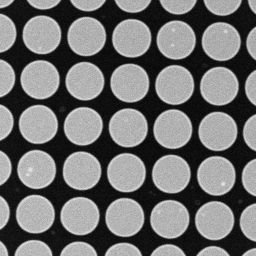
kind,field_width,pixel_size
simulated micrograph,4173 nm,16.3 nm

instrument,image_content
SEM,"an array of small figures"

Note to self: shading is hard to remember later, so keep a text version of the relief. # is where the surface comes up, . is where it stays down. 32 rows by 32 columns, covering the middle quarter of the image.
..######......#####.......###...
.########....#######.....######.
.#########..#########...########
##########..#########..#########
##########..#########..#########
##########..#########..#########
.########...#########..#########
..#######...#########..#########
...#####......######....#######.
...............###.......#####..
................................
...#####......####........###...
.########....#######....######..
.########...########...########.
##########.##########..#########
##########.##########.##########
#########..##########.##########
#########...#########.##########
.########...########...########.
..#####......#######....#######.
..............####.......#####..
................................
..####.........##...............
.#######....#######.....#####...
#########...########...#######..
#########..#########...########.
#########..#########..#########.
#########..#########..##########
#########..#########..##########
.#######...#########..#########.
.######.....#######....########.
....#........#####......######..